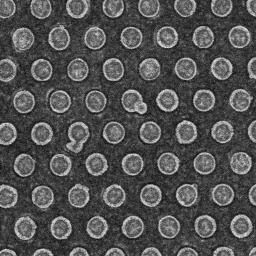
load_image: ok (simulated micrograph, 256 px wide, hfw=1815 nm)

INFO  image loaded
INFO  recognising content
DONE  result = a regular array of raised bodies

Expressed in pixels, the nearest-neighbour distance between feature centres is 35.8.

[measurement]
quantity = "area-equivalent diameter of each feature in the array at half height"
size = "148 nanometers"